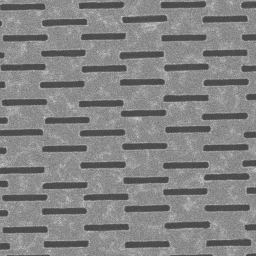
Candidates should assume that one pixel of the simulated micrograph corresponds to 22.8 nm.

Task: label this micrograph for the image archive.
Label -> a regular array of holes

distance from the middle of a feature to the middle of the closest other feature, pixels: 31